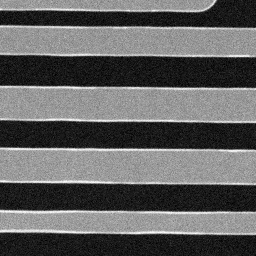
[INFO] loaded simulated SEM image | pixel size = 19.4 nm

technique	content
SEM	groups of lines, slits or small figures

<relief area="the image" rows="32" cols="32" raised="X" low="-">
XXXXXXXXXXXXXXXXXXXXXXXXXXX-----
--------------------------------
--------------------------------
XXXXXXXXXXXXXXXXXXXX------------
XXXXXXXXXXXXXXXXXXXXXXXXXXXXXXXX
XXXXXXXXXXXXXXXXXXXXXXXXXXXXXXXX
XXXXXXXXXXXXXXXXXXXXXXXXXXXXXXXX
--------------------------------
--------------------------------
--------------------------------
--------------------------------
XXXXXXXXXXXXXXXXXXXXXXXXXXXXXXXX
XXXXXXXXXXXXXXXXXXXXXXXXXXXXXXXX
XXXXXXXXXXXXXXXXXXXXXXXXXXXXXXXX
XXXXXXXXXXXXXXXXXXXXXXXXXXXXXXXX
--------------------------------
--------------------------------
--------------------------------
--------------------------------
XXXXXXXXXXXXXXXXXXXXXXXXXXXXXXXX
XXXXXXXXXXXXXXXXXXXXXXXXXXXXXXXX
XXXXXXXXXXXXXXXXXXXXXXXXXXXXXXXX
XXXXXXXXXXXXXXXXXXXXXXXXXXXXXXXX
--------------------------------
--------------------------------
--------------------------------
XXXX--XXXXXXXXXXX---------------
XXXXXXXXXXXXXXXXXXXXXXXXXXXXXXXX
XXXXXXXXXXXXXXXXXXXXXXXXXXXXXXXX
--------------------------------
--------------------------------
--------------------------------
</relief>